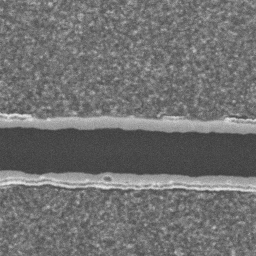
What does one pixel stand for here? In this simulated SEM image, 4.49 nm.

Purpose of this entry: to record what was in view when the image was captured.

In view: one or a few lines or trenches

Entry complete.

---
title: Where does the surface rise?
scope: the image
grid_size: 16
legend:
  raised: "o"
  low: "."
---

oooooooooooooooo
oooooooooooooooo
oooooooooooooooo
oooooooooooooooo
oooooooooooooooo
oooooooooooooooo
oooooooooooooooo
oooooooooooooooo
................
................
................
oooooooooooooooo
oooooooooooooooo
oooooooooooooooo
oooooooooooooooo
oooooooooooooooo